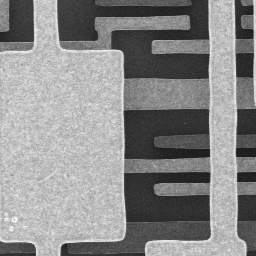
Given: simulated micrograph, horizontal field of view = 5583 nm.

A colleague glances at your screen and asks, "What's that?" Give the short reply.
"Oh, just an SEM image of wiring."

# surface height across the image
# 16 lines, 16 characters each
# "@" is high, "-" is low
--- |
--@@---------@@-
--@@---------@@-
--@@---------@@-
@@@@@@@@-----@@-
@@@@@@@@-----@@-
@@@@@@@@-----@@-
@@@@@@@@-----@@-
@@@@@@@@-----@@-
@@@@@@@@-----@@-
@@@@@@@@-----@@-
@@@@@@@@-----@@-
@@@@@@@@-----@@-
@@@@@@@@-----@@-
@@@@@@@@-----@@-
@@@@@@@@-----@@-
--@@-----@@@@@@-